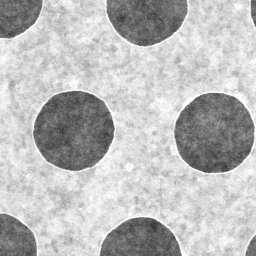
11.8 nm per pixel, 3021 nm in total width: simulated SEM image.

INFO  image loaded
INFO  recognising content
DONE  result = holes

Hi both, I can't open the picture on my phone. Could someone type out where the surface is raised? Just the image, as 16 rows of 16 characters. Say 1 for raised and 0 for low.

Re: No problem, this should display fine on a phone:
0001111000001111
0011111000011111
1111111100111111
1111111111111111
1111111111111111
1111111111111111
1110000111110001
1100000111100000
1100000111100000
1100000111100000
1111001111110001
1111111111111111
1111111111111111
0111111111111111
0011111000011111
0011110000011110